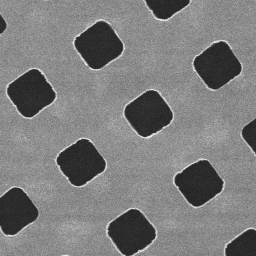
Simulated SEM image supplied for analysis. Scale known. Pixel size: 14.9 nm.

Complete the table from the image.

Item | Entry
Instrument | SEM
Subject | holes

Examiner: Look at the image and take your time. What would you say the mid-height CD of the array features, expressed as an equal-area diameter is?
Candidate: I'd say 0.656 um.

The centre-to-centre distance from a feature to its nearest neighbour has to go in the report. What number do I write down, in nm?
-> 1240